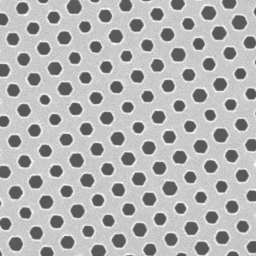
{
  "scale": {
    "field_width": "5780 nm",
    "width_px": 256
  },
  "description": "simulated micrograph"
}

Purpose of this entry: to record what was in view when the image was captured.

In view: a regular array of holes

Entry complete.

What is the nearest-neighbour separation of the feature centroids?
512 nm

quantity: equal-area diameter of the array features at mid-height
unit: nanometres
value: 301